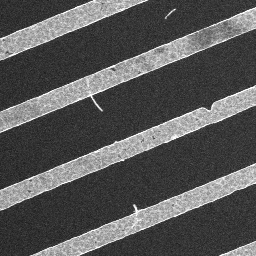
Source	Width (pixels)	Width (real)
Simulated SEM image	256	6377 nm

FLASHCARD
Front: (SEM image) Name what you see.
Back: one or a few lines or trenches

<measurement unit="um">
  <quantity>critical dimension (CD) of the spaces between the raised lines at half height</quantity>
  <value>1.33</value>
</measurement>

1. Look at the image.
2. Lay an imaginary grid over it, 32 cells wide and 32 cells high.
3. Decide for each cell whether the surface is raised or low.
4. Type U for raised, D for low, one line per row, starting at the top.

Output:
DDDDDDDDDDDUUUUUUDDDDDDDDDDDDDDD
DDDDDDDDUUUUUUUDDDDDDDDDDDDDDDDU
DDDDDDUUUUUUDDDDDDDDDDDDDDDDUUUU
DDDUUUUUUUDDDDDDDDDDDDDDDDUUUUUU
DUUUUUUDDDDDDDDDDDDDDDDUUUUUUDDD
UUUUUDDDDDDDDDDDDDDDDUUUUUDDDDDD
UUUDDDDDDDDDDDDDDDUUUUUUUDDDDDDD
DDDDDDDDDDDDDDDDUUUUUUDDDDDDDDDD
DDDDDDDDDDDDDDUUUUUUDDDDDDDDDDDD
DDDDDDDDDDDUUUUUUDDDDDDDDDDDDDDD
DDDDDDDDDUUUUUUDDDDDDDDDDDDDDDDD
DDDDDDUUUUUUDDDDDDDDDDDDDDDDDDUU
DDDDUUUUUUDDDDDDDDDDDDDDDDDDUUUU
DUUUUUUUDDDDDDDDDDDDDDDDDDUUUUUD
UUUUUDDDDDDDDDDDDDDDDDDUUUUUUDDD
UUUDDDDDDDDDDDDDDDDDDUUUUUDDDDDD
DDDDDDDDDDDDDDDDDDUUUUUUDDDDDDDD
DDDDDDDDDDDDDDDDUUUUUUDDDDDDDDDD
DDDDDDDDDDDDDUUUUUUDDDDDDDDDDDDD
DDDDDDDDDDUUUUUUUDDDDDDDDDDDDDDD
DDDDDDDDUUUUUUDDDDDDDDDDDDDDDDDD
DDDDDDUUUUUUDDDDDDDDDDDDDDDDDDUU
DDDDUUUUUDDDDDDDDDDDDDDDDDDUUUUU
DUUUUUUDDDDDDDDDDDDDDDDDDUUUUUDD
UUUUDDDDDDDDDDDDDDDDDDDUUUUUDDDD
UUDDDDDDDDDDDDDDDDDDUUUUUUDDDDDD
DDDDDDDDDDDDDDDDDUUUUUUDDDDDDDDD
DDDDDDDDDDDDDDDUUUUUUDDDDDDDDDDD
DDDDDDDDDDDDUUUUUUDDDDDDDDDDDDDD
DDDDDDDDDDUUUUUUDDDDDDDDDDDDDDDD
DDDDDDDUUUUUUDDDDDDDDDDDDDDDDDDU
DDDDDUUUUUUDDDDDDDDDDDDDDDDDDUUU